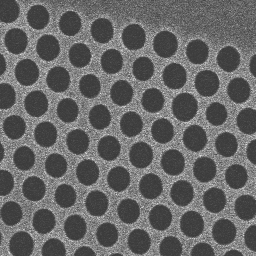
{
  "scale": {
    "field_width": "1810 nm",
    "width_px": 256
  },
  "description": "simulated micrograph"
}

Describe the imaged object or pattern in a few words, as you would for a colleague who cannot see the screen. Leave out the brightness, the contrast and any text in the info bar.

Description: a regular array of holes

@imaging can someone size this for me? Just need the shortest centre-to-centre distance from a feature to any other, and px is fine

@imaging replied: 32.1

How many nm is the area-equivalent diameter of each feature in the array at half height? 170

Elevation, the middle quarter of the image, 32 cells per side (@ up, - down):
@@@---@@@------@@-----@@@@----@@
-@@@@@@@@@----@@@-----@@@-----@@
-@@@@@@@@@@@@@@@@-----@@@------@
-@@@----@@@@@@@@@@----@@@------@
-@@@-----@@@@---@@@@@@@@@-----@@
-@@@-----@@@-----@@@@@@@@@----@@
@@@@-----@@@-----@@@@---@@@@@@@@
@@@@@---@@@@-----@@@----@@@@@---
@@@@@@-@@@@@-----@@------@@@----
---@@@@@@@@@----@@@------@@-----
---@@@@@--@@@@-@@@@@-----@@-----
----@@@----@@@@@@@@@----@@@-----
---@@@------@@@---@@@@@@@@@-----
---@@@------@@-----@@@@@-@@@----
--@@@@-----@@@------@@@----@@@@@
@@@@@@@----@@@------@@-----@@@@@
@@--@@@@@@@@@@-----@@@-----@@@--
@-----@@@@@@@@@----@@@-----@@@--
@-----@@@@---@@@@@@@@@-----@@@--
@-----@@@-----@@@@--@@@---@@@@--
@-----@@------@@@----@@@@@@@@@--
@-----@@------@@------@@@@--@@@-
@@@-@@@@@-----@@------@@@----@@@
@@@@@@@@@@---@@@------@@------@@
-@@@---@@@@@@@@@@-----@@------@@
-@@-----@@@@@@@@@@---@@@------@@
-@@------@@@----@@@@@@@@@-----@@
@@@------@@-----@@@@@--@@@---@@@
@@@------@@------@@-----@@@@@@@@
@@@@----@@@-----@@@-----@@@@---@
--@@@@@@@@@-----@@@------@@-----
---@@@@@@@@@---@@@@-----@@@-----